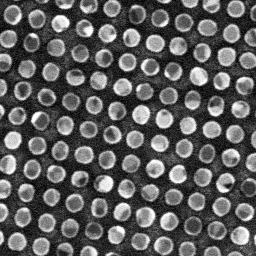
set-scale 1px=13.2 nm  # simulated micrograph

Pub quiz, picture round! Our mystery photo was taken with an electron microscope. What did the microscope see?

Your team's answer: a regular array of raised bodies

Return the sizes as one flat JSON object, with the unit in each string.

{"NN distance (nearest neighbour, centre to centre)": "312 nanometers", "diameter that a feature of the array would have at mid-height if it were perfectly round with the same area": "0.217 um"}